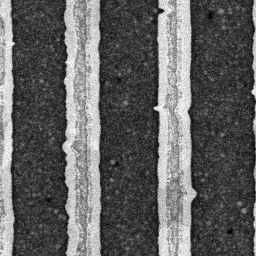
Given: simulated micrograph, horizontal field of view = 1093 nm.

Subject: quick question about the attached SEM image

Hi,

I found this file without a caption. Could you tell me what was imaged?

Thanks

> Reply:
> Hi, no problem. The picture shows one or a few lines or trenches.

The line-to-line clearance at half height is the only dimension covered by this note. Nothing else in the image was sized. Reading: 0.278 um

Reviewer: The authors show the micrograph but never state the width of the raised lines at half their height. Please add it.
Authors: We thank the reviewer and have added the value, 102 nm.